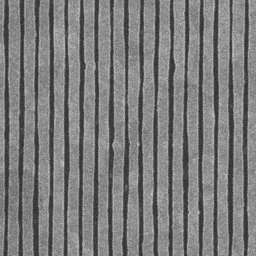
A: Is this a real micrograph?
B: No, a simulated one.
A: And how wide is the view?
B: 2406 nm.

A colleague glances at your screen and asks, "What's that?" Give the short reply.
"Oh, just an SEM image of parallel lines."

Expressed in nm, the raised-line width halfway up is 89.3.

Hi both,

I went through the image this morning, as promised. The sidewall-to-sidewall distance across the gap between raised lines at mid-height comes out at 48.2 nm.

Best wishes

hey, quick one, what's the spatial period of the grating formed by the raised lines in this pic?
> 140 nm